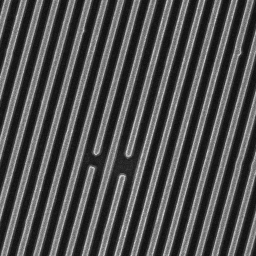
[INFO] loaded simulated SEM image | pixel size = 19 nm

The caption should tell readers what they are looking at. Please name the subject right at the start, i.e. parallel lines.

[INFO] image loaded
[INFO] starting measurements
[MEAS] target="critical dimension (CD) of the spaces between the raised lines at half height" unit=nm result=174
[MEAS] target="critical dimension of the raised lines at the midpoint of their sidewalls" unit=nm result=124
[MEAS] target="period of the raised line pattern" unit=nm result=298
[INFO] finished